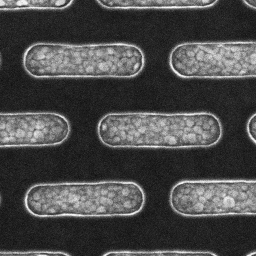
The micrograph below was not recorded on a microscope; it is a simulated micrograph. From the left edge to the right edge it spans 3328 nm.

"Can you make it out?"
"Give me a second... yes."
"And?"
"holes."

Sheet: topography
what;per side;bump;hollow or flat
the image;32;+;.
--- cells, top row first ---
.........++++.............+++++.
++++++++++++++++++++++++++++++++
++++++++++++++++++++++++++++++++
++++++++++++++++++++++++++++++++
++++++++++++++++++++++++++++++++
++++++++++++++++++++++++++......
+++...............++++..........
+++...............+++...........
+++...............++++..........
+++++..++.+..+..+++++++.......++
++++++++++++++++++++++++++++++++
++++++++++++++++++++++++++++++++
++++++++++++++++++++++++++++++++
++++++++++++++++++++++++++++++++
.......++++++..............+++++
........+++++..............++++.
........++++...............++++.
........+++++..............+++++
++++++++++++++++++++++++++++++++
++++++++++++++++++++++++++++++++
++++++++++++++++++++++++++++++++
++++++++++++++++++++++++++++++++
++++++++++++++++++++++++++++++++
++++.............+++++..........
+++...............++++..........
+++...............++++..........
++++.............+++++..........
++++++++++++++++++++++++++++++++
++++++++++++++++++++++++++++++++
++++++++++++++++++++++++++++++++
++++++++++++++++++++++++++++++++
+++++++++++++++.++++++++++++++++